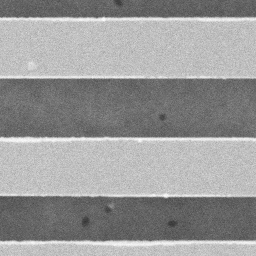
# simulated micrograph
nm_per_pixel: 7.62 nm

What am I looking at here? lines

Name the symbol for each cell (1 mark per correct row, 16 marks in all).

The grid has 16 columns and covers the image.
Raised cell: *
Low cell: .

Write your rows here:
................
****************
****************
****************
****************
................
................
................
................
****************
****************
****************
................
................
................
****************